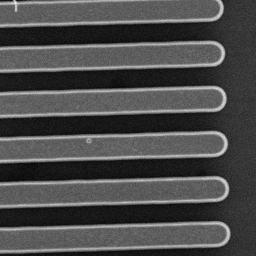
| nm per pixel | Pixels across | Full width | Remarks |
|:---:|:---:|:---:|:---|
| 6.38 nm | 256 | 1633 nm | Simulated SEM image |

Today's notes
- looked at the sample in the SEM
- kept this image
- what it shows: groups of lines, slits or small figures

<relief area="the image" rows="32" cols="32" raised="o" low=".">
oooooooooooooooooooooooooooo....
oooooooooooooooooooooooooooo....
oooooooooooooooooooooooooo......
................................
................................
.................oooooooooo.....
oooooooooooooooooooooooooooo....
oooooooooooooooooooooooooooo....
oooooooooooooooo................
................................
................................
........oooooooooooooooooooo....
oooooooooooooooooooooooooooo....
oooooooooooooooooooooooooooo....
oo..............................
................................
................................
oooooooooooooooooooooooooooo....
oooooooooooooooooooooooooooo....
oooooooooooooooooooooooo........
................................
................................
...............ooooooooooooo....
oooooooooooooooooooooooooooo....
oooooooooooooooooooooooooooo....
ooooooooooooo...................
................................
................................
.....ooooooooooooooooooooooo....
ooooooooooooooooooooooooooooo...
oooooooooooooooooooooooooooo....
................................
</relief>